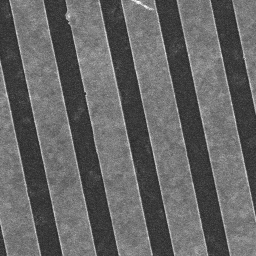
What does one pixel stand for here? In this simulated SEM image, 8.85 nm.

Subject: parallel lines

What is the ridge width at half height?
290 nm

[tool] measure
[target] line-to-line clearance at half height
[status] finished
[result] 196 nm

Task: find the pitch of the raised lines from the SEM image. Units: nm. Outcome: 483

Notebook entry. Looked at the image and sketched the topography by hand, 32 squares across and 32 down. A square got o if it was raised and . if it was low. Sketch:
.oooo...oooo...oooo...oooo...ooo
..oooo..ooooo..ooooo..ooooo..ooo
..oooo..ooooo...oooo...oooo...oo
..oooo...oooo...oooo...oooo...oo
..oooo...oooo...oooo...oooo...oo
..oooo...ooooo..oooo...oooo...oo
...oooo...oooo..ooooo..ooooo..oo
...oooo...oooo...oooo...oooo...o
...oooo...oooo...oooo...oooo...o
...oooo...oooo...oooo...oooo...o
o..ooooo..ooooo..oooo...oooo...o
o...oooo...oooo...oooo...oooo..o
o...oooo...oooo...oooo...oooo...
o...oooo...oooo...oooo...oooo...
o...oooo...oooo...oooo...oooo...
oo..ooooo..ooooo..ooooo..oooo...
oo...oooo...oooo...oooo...oooo..
oo...oooo...oooo...oooo...oooo..
oo...oooo...oooo...oooo...oooo..
oo...oooo...oooo...oooo...oooo..
ooo...oooo..ooooo..ooooo..ooooo.
ooo...oooo...oooo...oooo...oooo.
ooo...oooo...oooo...oooo...oooo.
ooo...oooo...oooo...oooo...oooo.
oooo..oooo...oooo...oooo...oooo.
oooo..ooooo...oooo..ooooo..ooooo
oooo...oooo...oooo...oooo...oooo
oooo...oooo...oooo...oooo...oooo
oooo...oooo...oooo...oooo...oooo
ooooo..ooooo..ooooo..oooo...oooo
.oooo...oooo...oooo..ooooo..oooo
.oooo...oooo...oooo...oooo...ooo